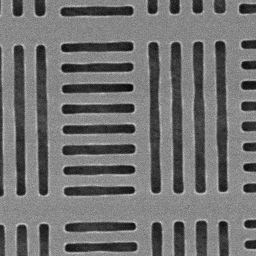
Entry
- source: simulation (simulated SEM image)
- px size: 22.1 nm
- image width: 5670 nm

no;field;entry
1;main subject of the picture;groups of lines, slits or small figures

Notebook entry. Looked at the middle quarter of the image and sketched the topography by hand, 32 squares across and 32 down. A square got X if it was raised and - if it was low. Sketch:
------------------XXX---XX----XX
-----------------XXXX---XX----XX
XXXXXXXXXXXXXXXXXXXXX---XXX---XX
XXXXXXXXXXXXXXXXXXXXX---XXX---XX
XXXXXXXXXXXXXXXXXXXXX---XXX---XX
-----------------XXXX---XXX---XX
-----------------XXXX---XXX---XX
------XXXXXXXXXXXXXXX---XXX---XX
XXXXXXXXXXXXXXXXXXXXX---XXX---XX
XXXXXXXXXXXXXXXXXXXXX---XXX---XX
------------------XXX---XXX---XX
------------------XXX---XXX---XX
---XXXXXXXXXXXXXXXXXX---XXX---XX
XXXXXXXXXXXXXXXXXXXXX---XXX---XX
XXXXXXXXXXXXXXXXXXXXX---XXX---XX
------------------XXX---XXX---XX
------------------XXX---XXX---XX
-------------XX--XXXX---XXX---XX
XXXXXXXXXXXXXXXXXXXXX---XXX---XX
XXXXXXXXXXXXXXXXXXXXX---XXX---XX
------------------XXX---XXX---XX
------------------XXX---XXX---XX
-----------------XXXX---XXX---XX
XXXXXXXXXXXXXXXXXXXXX---XXX---XX
XXXXXXXXXXXXXXXXXXXXX---XXX---XX
XXX--------------XXXX---XXX---XX
------------------XXX---XXX---XX
-----------------XXXX---XXX---XX
XXXXXXXXXXXXXXXXXXXXX---XXX---XX
XXXXXXXXXXXXXXXXXXXXX---XXX---XX
XXX--------------XXXXX--XXX---XX
------------------XXXX--XXX---XX